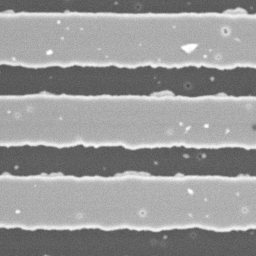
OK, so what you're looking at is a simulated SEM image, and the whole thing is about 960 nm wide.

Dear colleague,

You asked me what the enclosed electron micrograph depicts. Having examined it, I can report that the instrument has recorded lines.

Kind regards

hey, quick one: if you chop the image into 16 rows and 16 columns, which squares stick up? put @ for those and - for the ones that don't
----------------
@@@@@@@@@@@@@@@@
@@@@@@@@@@@@@@@@
@@@@@@@@@@@@@@@@
----------------
----------------
@@@@@@@@@@@@@@@@
@@@@@@@@@@@@@@@@
@@@@@@@@@@@@@@@@
----------------
----------------
@@@@@@@@@@@@@@@@
@@@@@@@@@@@@@@@@
@@@@@@@@@@@@@@@@
----------------
----------------